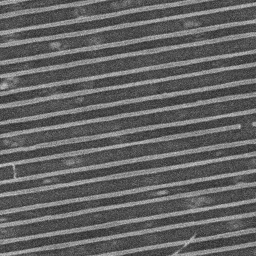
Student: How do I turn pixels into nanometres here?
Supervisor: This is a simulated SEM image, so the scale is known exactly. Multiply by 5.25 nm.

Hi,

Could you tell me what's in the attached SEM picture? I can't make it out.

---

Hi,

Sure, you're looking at parallel lines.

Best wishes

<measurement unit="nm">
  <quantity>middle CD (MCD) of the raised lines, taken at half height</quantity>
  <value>19.4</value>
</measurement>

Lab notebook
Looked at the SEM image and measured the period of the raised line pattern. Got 14.7 px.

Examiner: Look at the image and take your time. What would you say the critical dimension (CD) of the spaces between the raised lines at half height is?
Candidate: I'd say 53.1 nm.